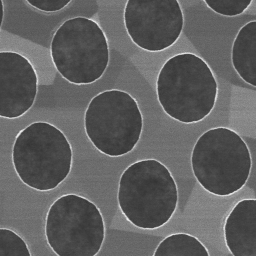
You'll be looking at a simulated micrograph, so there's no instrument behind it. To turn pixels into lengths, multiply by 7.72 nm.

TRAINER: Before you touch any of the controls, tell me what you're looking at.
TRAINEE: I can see holes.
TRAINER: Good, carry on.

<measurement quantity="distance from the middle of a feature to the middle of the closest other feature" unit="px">79.3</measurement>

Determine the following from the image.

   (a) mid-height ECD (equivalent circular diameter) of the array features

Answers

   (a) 481 nm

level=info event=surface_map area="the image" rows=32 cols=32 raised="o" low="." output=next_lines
oooo....oooooooo......o..o.....o
oooooooooooooooo.......oooo...oo
ooooooooo..ooooo.......ooooooooo
ooooooo.....oooo.......ooooooo..
ooooooo......ooo......oooooooo..
oooooo.......oooo....oooooooo...
oooooo........ooooooooooooooo...
...oooo.......ooooooo....oooo...
....ooo......ooooooo......ooo...
.....ooo.....ooooooo.......ooo..
.....ooooooooooooooo.......o..o.
.....oooooooo..ooooo.......ooooo
....oooooooo.....ooo.......ooooo
....oo.oooo......ooo.......ooooo
..ooooooooo.......ooo.....oooooo
oooo..ooooo.......oooooooooooooo
ooo.....ooo.......oooooooo...ooo
oo......ooo......oooooooo.....oo
oo.......ooo.....ooooooo.......o
oo.......ooooooooooooooo.......o
oo.......oooooooo...oooo.......o
oo.......ooooooo.....ooo.......o
ooo.....ooooooo.......ooo......o
oooo...oooooooo.......oooo....oo
oooooooo..ooooo.......oooooooooo
ooooooo.....ooo.......oooooooo..
oooooo......ooo.......ooooooo...
oooooo.......ooo.....ooooooo....
oooooo........oooo.ooooooooo....
..oooo.......oooooooo...oooo....
...ooo.......ooooooo.....ooo....
....ooo.....ooooooo.......ooo...